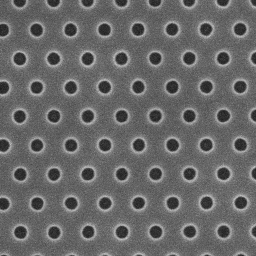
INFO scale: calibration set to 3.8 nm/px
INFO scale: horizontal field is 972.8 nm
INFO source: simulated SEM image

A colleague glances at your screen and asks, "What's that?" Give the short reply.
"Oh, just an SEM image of a regular array of holes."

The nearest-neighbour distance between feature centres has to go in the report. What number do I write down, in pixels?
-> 33.3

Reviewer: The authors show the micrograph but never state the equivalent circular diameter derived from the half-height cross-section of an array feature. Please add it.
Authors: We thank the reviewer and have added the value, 0.0484 µm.